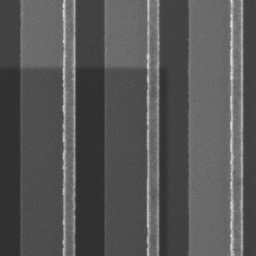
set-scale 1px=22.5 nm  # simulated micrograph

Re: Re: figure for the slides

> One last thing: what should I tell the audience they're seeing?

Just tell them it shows lines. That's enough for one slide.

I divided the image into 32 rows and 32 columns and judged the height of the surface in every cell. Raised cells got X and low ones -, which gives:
---XXXXXX----XXXXXXX----XXXXXX--
---XXXXXX----XXXXXXX----XXXXXX--
---XXXXXX----XXXXXXX----XXXXXX--
---XXXXXX----XXXXXXX----XXXXXX--
---XXXXXX----XXXXXXX----XXXXXX--
---XXXXXX----XXXXXXX----XXXXXX--
---XXXXXX----XXXXXXX----XXXXXX--
---XXXXXX----XXXXXXX----XXXXXX--
---XXXXXX----XXXXXXX----XXXXXX--
---XXXXXX----XXXXXXX----XXXXXX--
---XXXXXX----XXXXXXX----XXXXXX--
---XXXXXX----XXXXXXX----XXXXXX--
---XXXXXX----XXXXXXX----XXXXXX--
---XXXXXX----XXXXXXX----XXXXXX--
---XXXXXX----XXXXXXX----XXXXXX--
---XXXXXX----XXXXXXX----XXXXXX--
---XXXXXX----XXXXXXX----XXXXXX--
---XXXXXX----XXXXXXX----XXXXXX--
---XXXXXX----XXXXXXX----XXXXXX--
---XXXXXX----XXXXXXX----XXXXXX--
---XXXXXX----XXXXXXX----XXXXXX--
---XXXXXX----XXXXXXX----XXXXXX--
---XXXXXX----XXXXXXX----XXXXXX--
---XXXXXX----XXXXXXX----XXXXXX--
---XXXXXX----XXXXXXX----XXXXXX--
---XXXXXX----XXXXXXX----XXXXXX--
---XXXXXX----XXXXXXX----XXXXXX--
---XXXXXX----XXXXXXX----XXXXXX--
---XXXXXX----XXXXXXX----XXXXXX--
---XXXXXX----XXXXXXX----XXXXXX--
---XXXXXX----XXXXXXX----XXXXXX--
---XXXXXX----XXXXXXX----XXXXXX--